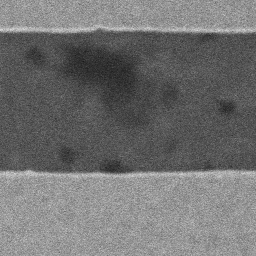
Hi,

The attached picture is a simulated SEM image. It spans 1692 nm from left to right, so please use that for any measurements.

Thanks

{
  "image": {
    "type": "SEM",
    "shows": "one or a few lines or trenches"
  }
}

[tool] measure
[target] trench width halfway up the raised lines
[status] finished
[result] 952 nm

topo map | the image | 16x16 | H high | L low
HHHHHHHHHHHHHHHH
HHHHHHHHHHHHHHHH
LLLLLLLLLLLLLLLL
LLLLLLLLLLLLLLLL
LLLLLLLLLLLLLLLL
LLLLLLLLLLLLLLLL
LLLLLLLLLLLLLLLL
LLLLLLLLLLLLLLLL
LLLLLLLLLLLLLLLL
LLLLLLLLLLLLLLLL
LLLLLLLLLLLLLLLL
HHHHHHHHHHHHHHHH
HHHHHHHHHHHHHHHH
HHHHHHHHHHHHHHHH
HHHHHHHHHHHHHHHH
HHHHHHHHHHHHHHHH